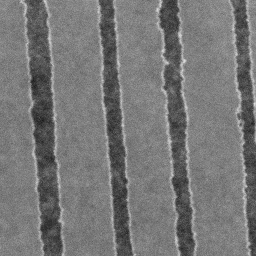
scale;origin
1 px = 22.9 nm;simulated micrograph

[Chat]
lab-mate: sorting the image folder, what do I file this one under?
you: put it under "one or a few lines or trenches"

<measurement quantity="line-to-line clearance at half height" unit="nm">1150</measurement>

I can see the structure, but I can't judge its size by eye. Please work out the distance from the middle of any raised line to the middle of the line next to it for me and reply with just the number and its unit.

1540 nanometers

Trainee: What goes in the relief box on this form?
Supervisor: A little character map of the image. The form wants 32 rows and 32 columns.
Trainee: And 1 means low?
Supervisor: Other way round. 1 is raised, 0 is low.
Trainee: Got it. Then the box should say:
00011100000011000000110000000110
00011100000011000000110000000110
00011100000011000000111000000110
00011100000011000000111000000110
00011100000001100000110000000110
00011100000001100000111000000110
00011100000001100000111000000010
00001100000001100000011000000110
00001110000001100000111000000010
00001110000001100000111000000010
00001110000001100000111000000011
00001110000001100000011000000011
00001110000001100000011000000011
00001110000001100000011000000011
00001110000001100000011000000011
00001110000001100000011000000011
00001110000001100000011000000011
00001110000001100000011000000011
00001110000001110000011000000011
00001110000000110000011000000011
00001110000000110000001000000011
00000110000000110000001100000001
00000110000000110000011100000001
00000110000000110000001100000001
00000110000000110000001100000001
00000110000000110000001100000001
00000111000000110000001100000001
00000111000000110000001100000001
00000111000000110000001100000001
00000111000000110000001100000001
00000111000000110000001100000001
00000111000000111000001100000001